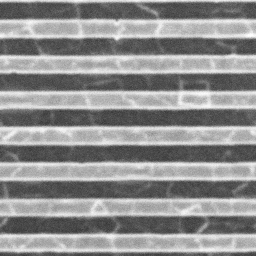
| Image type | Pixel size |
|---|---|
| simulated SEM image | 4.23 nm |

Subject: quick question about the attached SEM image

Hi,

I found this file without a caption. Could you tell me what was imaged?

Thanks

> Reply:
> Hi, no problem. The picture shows parallel lines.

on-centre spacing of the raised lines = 0.151 micrometres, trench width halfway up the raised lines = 86.7 nm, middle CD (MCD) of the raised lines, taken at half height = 0.0666 um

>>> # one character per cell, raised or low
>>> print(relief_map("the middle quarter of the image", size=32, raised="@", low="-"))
@@@@@@@@@@@@@@@@@@@@@@@@@@@@@@@@
@@@@@@@@@@@@@@@@@@@@@@@@@@@@@@@@
--------------------------------
--------------------------------
--------------------------------
--------------------------------
--------------------------------
@@@@@@@@@@@@@@@@@@@@@@@@@@@@@@@@
@@@@@@@@@@@@@@@@@@@@@@@@@@@@@@@@
@@@@@@@@@@@@@@@@@@@@@@@@@@@@@@@@
@@@@@@@@@@@@@@@@@@@@@@@@@@@@@@@@
--------------------------------
--------------------------------
--------------------------------
--------------------------------
--------------------------------
@@@@@@@@@@@@@@@@@@@@@@@@@@@@@@@@
@@@@@@@@@@@@@@@@@@@@@@@@@@@@@@@@
@@@@@@@@@@@@@@@@@@@@@@@@@@@@@@@@
@@@@@@@@@@@@@@@@@@@@@@@@@@@@@@@@
--------------------------------
--------------------------------
--------------------------------
--------------------------------
--------------------------------
@@@@@@@@@@@@@@@@@@@@@@@@@@@@@@@@
@@@@@@@@@@@@@@@@@@@@@@@@@@@@@@@@
@@@@@@@@@@@@@@@@@@@@@@@@@@@@@@@@
@@@@@@@@@@@@@@@@@@@@@@@@@@@@@@@@
--------------------------------
--------------------------------
--------------------------------